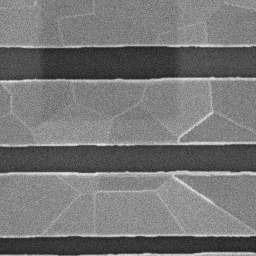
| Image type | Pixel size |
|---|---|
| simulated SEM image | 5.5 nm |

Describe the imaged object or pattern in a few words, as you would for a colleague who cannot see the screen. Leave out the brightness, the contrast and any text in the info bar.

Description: lines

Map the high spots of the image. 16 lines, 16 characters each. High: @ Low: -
@@@@@@@@@@@@@@@@
@@@@@@@@@@@@@@@@
@@@@@@@@@@@@@@@@
----------------
----------------
@@@@@@@@@@@@@@@@
@@@@@@@@@@@@@@@@
@@@@@@@@@@@@@@@@
@@@@@@@@@@@@@@@@
----------------
----------------
@@@@@@@@@@@@@@@@
@@@@@@@@@@@@@@@@
@@@@@@@@@@@@@@@@
@@@@@@@@@@@@@@@@
----------------